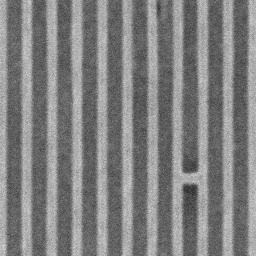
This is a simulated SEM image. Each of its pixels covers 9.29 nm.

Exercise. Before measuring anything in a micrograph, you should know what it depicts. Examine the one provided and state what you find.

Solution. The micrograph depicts parallel lines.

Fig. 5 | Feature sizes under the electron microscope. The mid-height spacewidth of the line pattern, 0.16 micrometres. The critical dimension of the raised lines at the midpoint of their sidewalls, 72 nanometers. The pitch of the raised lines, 234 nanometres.